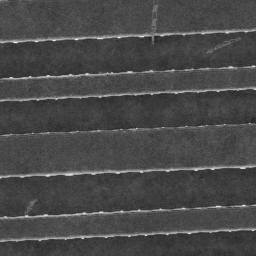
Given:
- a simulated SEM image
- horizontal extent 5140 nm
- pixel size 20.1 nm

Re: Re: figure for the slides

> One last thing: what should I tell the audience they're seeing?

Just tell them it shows lines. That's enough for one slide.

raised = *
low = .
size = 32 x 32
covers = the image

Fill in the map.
********************************
********************************
********************************
********************************
****************................
................................
................................
................................
..............................**
........************************
********************************
***********************.........
****............................
................................
................................
................................
...........*********************
********************************
********************************
********************************
********************************
****************................
................................
................................
................................
................................
................****************
********************************
********************************
**************..................
................................
................................